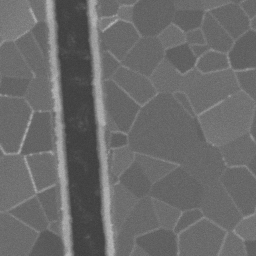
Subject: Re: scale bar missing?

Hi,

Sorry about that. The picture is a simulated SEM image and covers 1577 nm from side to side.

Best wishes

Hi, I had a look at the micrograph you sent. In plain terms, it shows one or a few lines or trenches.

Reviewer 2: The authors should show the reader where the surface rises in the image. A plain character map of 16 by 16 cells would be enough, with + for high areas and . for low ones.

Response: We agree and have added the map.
+++...++++++++++
+++...++++++++++
+++...++++++++++
+++...++++++++++
+++...++++++++++
+++...++++++++++
++++..++++++++++
++++..++++++++++
++++..++++++++++
++++..++++++++++
++++...+++++++++
++++...+++++++++
++++...+++++++++
++++...+++++++++
++++...+++++++++
++++...+++++++++